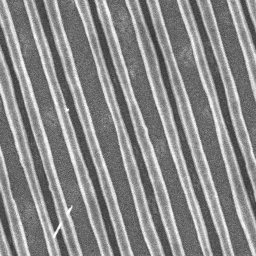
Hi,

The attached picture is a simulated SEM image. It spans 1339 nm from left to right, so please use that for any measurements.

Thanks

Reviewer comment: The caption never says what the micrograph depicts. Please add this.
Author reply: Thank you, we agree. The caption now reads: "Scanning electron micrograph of parallel lines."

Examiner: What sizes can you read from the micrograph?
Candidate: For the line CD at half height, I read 54.4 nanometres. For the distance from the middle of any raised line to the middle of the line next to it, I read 127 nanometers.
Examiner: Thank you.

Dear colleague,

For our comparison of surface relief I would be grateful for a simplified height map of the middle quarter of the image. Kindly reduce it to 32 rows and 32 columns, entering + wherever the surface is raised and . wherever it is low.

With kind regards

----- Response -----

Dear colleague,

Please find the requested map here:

+++.....++...++......+++..++....
+++......++..++......+++..+++...
+++......++..+++.....+++..+++...
.++......++...++.....+++..+++...
.+++.....++...++......+++..++...
..++......++..+++.....+++..+++..
..++......++...++.....+++..+++..
..+++.....++...++.....+++...+++.
...++.....+++..+++.....+++..+++.
...++......++...++.....+++..+++.
...+++.....++...++.....+++...+++
+..+++......++..+++.....+++..+++
+...++......++...++.....+++..+++
+...+++.....++...++.....+++..+++
++..+++......++..+++.....++...++
++...++......++...++.....+++..++
+++..++......++...+++....+++..++
+++..+++.....+++..+++.....++..++
+++...++......++..+++.....+++..+
.++...++......++..+++.....+++..+
.++...+++.....+++..+++....+++...
.+++...++.....+++..+++.....++...
..++...++.....+++...+++....+++..
..+++..+++.....++...+++....+++..
..+++..+++.....+++..+++.....++..
...++...++.....+++...+++....++..
...+++..+++....+++...+++.....++.
...+++...++.....+++..+++.....++.
...+++...++.....+++..+++.....++.
....+++..+++....+++...+++....+++
....+++..+++.....++...+++.....++
....+++...++.....+++...+++....++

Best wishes